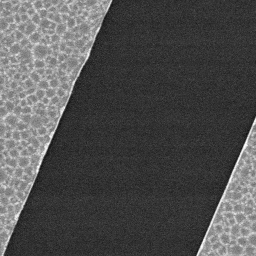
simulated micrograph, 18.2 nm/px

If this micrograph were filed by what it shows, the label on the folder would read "one or a few lines or trenches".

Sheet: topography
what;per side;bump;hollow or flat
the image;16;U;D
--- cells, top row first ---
UUUUUUUDDDDDDDDD
UUUUUUDDDDDDDDDD
UUUUUUDDDDDDDDDD
UUUUUUDDDDDDDDDD
UUUUUDDDDDDDDDDD
UUUUUDDDDDDDDDDD
UUUUDDDDDDDDDDDD
UUUUDDDDDDDDDDDD
UUUDDDDDDDDDDDDD
UUUDDDDDDDDDDDDU
UUDDDDDDDDDDDDDU
UUDDDDDDDDDDDDUU
UUDDDDDDDDDDDDUU
UDDDDDDDDDDDDUUU
UDDDDDDDDDDDDUUU
DDDDDDDDDDDDDUUU